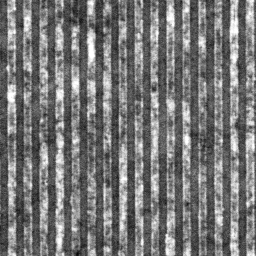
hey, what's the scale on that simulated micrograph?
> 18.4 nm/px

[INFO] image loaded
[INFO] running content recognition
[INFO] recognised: parallel lines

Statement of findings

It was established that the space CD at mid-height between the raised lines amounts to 170 nm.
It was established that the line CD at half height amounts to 124 nanometers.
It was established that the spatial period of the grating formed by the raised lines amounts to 293 nm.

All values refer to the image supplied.